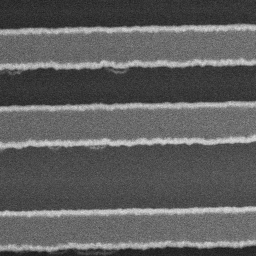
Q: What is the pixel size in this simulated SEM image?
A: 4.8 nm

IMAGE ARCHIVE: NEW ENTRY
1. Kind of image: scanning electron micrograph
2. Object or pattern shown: lines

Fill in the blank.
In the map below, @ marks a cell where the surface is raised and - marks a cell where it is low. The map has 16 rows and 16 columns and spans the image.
----------------
----------------
@@@@@@@@@@@@@@@@
@@@@@@@@@@@@@@@@
----------------
----------------
-------@@@@@@@@@
@@@@@@@@@@@@@@@@
@@@@@@@@@@@@@@@@
----------------
----------------
----------------
----------------
@@@@@@@@@@@@@@@@
@@@@@@@@@@@@@@@@
@@@@@@@@@-------